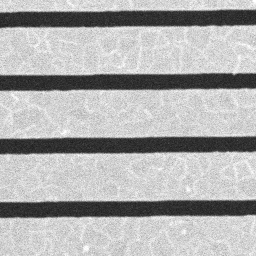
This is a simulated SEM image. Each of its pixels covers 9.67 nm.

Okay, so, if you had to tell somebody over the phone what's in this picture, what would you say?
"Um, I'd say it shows lines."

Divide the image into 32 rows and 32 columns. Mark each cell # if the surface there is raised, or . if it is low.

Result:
################################
................................
................................
..........#.####################
################################
################################
################################
################################
################################
................................
................................
################################
################################
################################
################################
################################
################################
................................
................................
################################
################################
################################
################################
################################
################################
................................
................................
################################
################################
################################
################################
################################